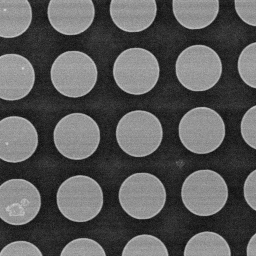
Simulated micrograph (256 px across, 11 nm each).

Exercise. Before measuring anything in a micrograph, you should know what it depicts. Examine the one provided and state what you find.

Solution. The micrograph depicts an array of small figures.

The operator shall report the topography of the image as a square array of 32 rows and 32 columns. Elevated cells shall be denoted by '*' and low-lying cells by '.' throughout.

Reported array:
****..******..******..*****..***
****..******..******..*****...**
****..******..*****...*****...**
***....****....***.....**.......
**..............................
...............................*
........**.....****....****...**
***....****....*****..******..**
****..******..******..******..**
****..******..******..******..**
****...*****...****....****....*
****...****.....**..............
.*..............................
........................**.....*
........***....****....****...**
****...*****...*****..******..**
*****..*****...*****..******..**
*****..*****...*****...*****...*
****...*****...*****...****.....
****....***......*..............
................................
........................***....*
.**.....****....****...*****...*
****...******..******..*****...*
*****..******..******..*****...*
*****..******..******..*****...*
*****...****....****....***.....
****.....**.....................
................................
.................**.....****....
.***....****....****...*****...*
*****...*****..******..******..*